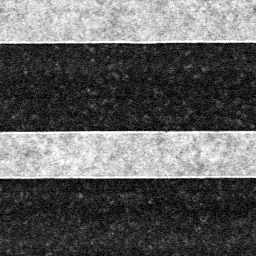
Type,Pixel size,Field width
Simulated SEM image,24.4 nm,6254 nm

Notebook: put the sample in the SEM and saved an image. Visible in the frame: one or a few lines or trenches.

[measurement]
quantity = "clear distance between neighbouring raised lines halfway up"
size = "2180 nm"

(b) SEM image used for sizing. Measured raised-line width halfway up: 1.11 micrometres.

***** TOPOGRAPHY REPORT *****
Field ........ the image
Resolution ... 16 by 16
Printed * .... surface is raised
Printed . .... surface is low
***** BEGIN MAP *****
****************
****************
****************
................
................
................
................
................
****************
****************
****************
................
................
................
................
................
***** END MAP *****